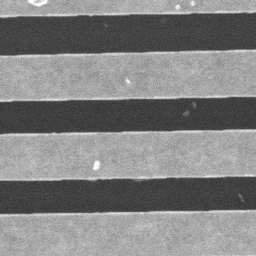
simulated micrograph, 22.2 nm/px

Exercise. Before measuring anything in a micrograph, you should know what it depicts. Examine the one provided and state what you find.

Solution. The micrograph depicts lines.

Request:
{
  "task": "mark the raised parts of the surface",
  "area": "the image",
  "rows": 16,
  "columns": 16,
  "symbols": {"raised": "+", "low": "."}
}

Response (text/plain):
++++++++++++++++
................
................
.+++++++++++++++
++++++++++++++++
++++++++++++++++
................
................
++++++++++++++++
++++++++++++++++
++++++++++++++++
................
................
++++++++++++++++
++++++++++++++++
++++++++++++++++